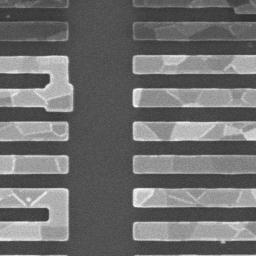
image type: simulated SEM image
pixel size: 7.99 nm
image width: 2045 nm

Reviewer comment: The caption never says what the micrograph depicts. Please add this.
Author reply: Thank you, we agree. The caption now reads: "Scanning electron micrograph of wiring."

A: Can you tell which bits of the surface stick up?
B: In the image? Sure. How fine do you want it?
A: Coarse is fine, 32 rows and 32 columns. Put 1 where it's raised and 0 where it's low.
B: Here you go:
11111111000000000111111111111111
00000000000000000000000000000011
00000000000000000000000000000000
11111111000000000111111111111111
11111111000000000111111111111111
00000000000000000000000000000000
00000000000000000000000000000000
11111111000000000111111111111111
11111111000000000111111111111111
00000011000000000000000000000000
00000011100000000000000000000000
11111111100000000111111111111111
11111111100000000111111111111111
00000111100000000000000000000000
00000000000000000000000000000000
11111111000000000111111111111111
11111111000000000111111111111111
11000000000000000000000000000000
00000000000000000000000000000000
01000000000000000000110001111110
11111111000000000111111111111111
11111111000000000111111111111111
00000000000000000000000000000000
00000000000000000000000000000000
11111111000000000111111111111111
11111111000000000111111111111111
00000011000000000000000000000000
00000011000000000000000000000000
11111111000000000111111111111111
11111111000000000111111111111111
00000000000000000000000000000000
00000000000000000000000000000000